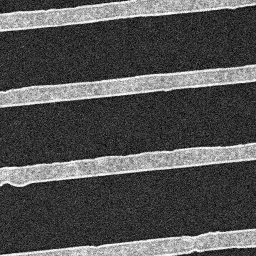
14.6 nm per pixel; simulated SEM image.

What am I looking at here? one or a few lines or trenches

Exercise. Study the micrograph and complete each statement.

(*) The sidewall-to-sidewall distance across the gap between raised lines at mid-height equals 910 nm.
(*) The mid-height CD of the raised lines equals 222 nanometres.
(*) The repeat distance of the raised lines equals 1150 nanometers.